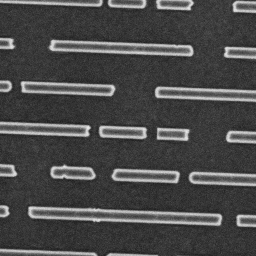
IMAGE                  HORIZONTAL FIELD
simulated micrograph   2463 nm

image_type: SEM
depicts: parallel lines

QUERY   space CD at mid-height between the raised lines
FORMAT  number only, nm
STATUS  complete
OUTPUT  311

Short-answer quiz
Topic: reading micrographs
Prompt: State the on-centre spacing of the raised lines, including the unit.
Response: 407 nm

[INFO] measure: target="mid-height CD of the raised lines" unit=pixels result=10.4